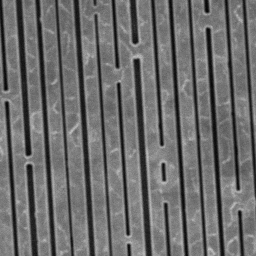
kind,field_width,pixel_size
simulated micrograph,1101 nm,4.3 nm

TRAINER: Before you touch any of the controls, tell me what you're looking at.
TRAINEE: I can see parallel lines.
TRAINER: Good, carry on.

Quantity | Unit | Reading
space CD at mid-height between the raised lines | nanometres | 22.5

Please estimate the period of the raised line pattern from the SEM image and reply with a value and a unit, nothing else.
80.8 nm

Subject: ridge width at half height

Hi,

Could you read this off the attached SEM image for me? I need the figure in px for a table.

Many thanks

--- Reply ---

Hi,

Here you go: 13.7